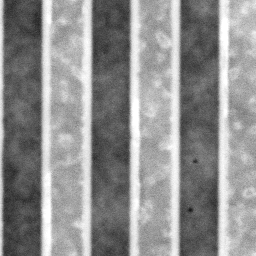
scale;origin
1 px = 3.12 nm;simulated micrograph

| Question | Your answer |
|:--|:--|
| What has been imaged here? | one or a few lines or trenches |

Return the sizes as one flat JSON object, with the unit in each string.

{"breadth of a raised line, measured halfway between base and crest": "0.136 µm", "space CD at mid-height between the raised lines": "139 nanometres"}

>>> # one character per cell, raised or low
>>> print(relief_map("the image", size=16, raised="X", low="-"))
---XXX--XXX---XX
---XXX--XXX---XX
---XXX--XXX---XX
---XXX--XXX---XX
---XXX--XXX---XX
---XXX--XXX---XX
---XXX--XXX---XX
---XX---XXX---XX
---XX---XXX---XX
---XX---XXX---XX
---XX---XXX---XX
---XX---XXX---XX
---XX---XXX---XX
---XX---XXX---XX
---XX---XXX---XX
---XX---XXX---XX